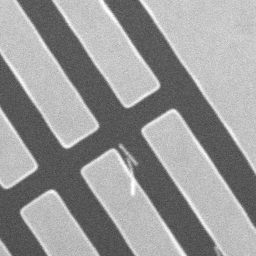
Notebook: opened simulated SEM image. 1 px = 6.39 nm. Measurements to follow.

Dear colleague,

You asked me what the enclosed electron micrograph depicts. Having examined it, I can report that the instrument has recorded groups of lines, slits or small figures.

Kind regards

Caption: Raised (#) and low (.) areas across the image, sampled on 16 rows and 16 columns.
#...###..#######
##..###...######
###..###..######
###...###..#####
.###..###...####
..###..###..####
..###........###
...###....#...##
#..##....###...#
##........###..#
##...###..###...
#....####..###..
..##..###...###.
.###...###..###.
..###...###..###
...###..###...##